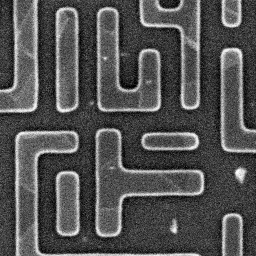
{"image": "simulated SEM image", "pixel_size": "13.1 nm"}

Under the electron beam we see wiring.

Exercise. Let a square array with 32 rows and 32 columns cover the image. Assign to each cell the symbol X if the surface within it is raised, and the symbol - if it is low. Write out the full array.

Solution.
--XXX-------------XX---XX---XX--
--XXX--XX---XX----XXXXXXX---XX--
--XXX--XXX--XXX---XXXXXXX---XX--
--XXX--XXX--XXX-------XXX-------
--XXX--XXX--XXX--------XX-------
--XXX--XXX--XXX--------XX-------
--XXX--XXX--XXX---XX---XX---XX--
--XXX--XXX--XXX--XXX---XX---XX--
--XXX--XXX--XXX--XXX---XX---XX--
--XXX--XXX--XXX--XXX---XX---XX--
--XXX--XXX--XXX--XXX---XX---XX--
XXXXX--XXX--XXXXXXXX---XX---XX--
XXXXX--XXX--XXXXXXXX---XX---XX--
XXXX---XX----XXXXXXX---X----XX--
----------------------------XX--
----------------------------XX--
------------XXX-------------XXXX
--XXXXXXXX--XXX---XXXXXXX---XXXX
--XXXXXXXX--XXX---XXXXXX----XXXX
--XXX-------XXX-----------------
--XXX-------XXX-----------------
--XXX-------XXXXXXXXXXXXX-------
--XXX--XXX--XXXXXXXXXXXXX-------
--XXX--XXX--XXXXXXXXXXXXX-------
--XXX--XXX--XXXX----------------
--XXX--XXX--XXX-----------------
--XXX--XXX--XXX-----------------
--XXX--XXX--XXX-------------XX--
--XXX--XXX--XXX-------------XX--
--XXX-----------------------XX--
--XXX-----------------------XX--
--XXX-----------------------XX--